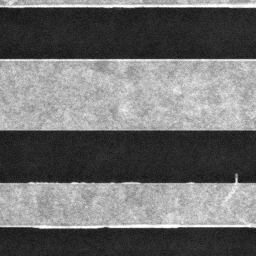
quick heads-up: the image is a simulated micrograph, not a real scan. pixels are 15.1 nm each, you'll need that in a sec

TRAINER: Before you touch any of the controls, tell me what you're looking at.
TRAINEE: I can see lines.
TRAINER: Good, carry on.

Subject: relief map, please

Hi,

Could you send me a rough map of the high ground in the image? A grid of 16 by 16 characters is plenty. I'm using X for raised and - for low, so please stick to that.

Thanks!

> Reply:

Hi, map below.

----------------
----------------
----------------
----------------
XXXXXXXXXXXXXXXX
XXXXXXXXXXXXXXXX
XXXXXXXXXXXXXXXX
XXXXXXXXXXXXXXXX
----------------
----------------
----------------
XXXXXXXXXXXXXXXX
XXXXXXXXXXXXXXXX
XXXXXXXXXXXXXXXX
----------------
----------------